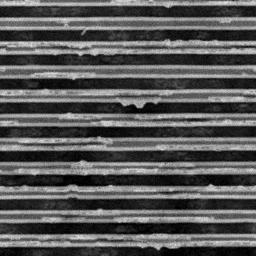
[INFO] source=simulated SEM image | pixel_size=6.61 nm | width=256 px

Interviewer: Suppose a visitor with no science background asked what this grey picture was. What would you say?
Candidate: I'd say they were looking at parallel lines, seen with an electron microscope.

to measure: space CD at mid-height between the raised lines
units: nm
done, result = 96.6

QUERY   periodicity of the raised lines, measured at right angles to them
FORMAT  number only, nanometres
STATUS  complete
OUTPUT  160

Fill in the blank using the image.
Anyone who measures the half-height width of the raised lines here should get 0.0661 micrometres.